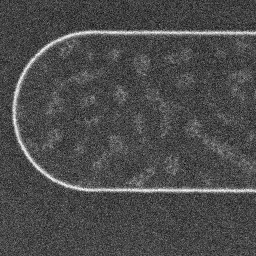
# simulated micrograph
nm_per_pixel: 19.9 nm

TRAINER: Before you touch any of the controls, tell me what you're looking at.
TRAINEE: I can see one or a few lines or trenches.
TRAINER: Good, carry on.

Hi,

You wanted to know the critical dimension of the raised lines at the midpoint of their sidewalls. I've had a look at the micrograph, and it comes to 3130 nm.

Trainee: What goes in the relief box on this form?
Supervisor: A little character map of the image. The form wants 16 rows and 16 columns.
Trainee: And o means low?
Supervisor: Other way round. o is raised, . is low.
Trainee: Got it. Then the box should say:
................
................
....oooooooooooo
..oooooooooooooo
..oooooooooooooo
.ooooooooooooooo
.ooooooooooooooo
.ooooooooooooooo
.ooooooooooooooo
..oooooooooooooo
..oooooooooooooo
....oooooooooooo
................
................
................
................